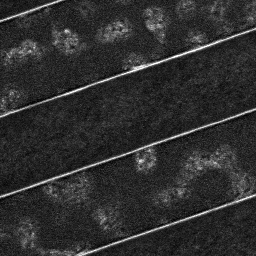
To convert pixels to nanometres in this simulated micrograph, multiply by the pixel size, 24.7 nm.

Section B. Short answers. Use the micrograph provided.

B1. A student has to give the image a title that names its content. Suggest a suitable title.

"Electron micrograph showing one or a few lines or trenches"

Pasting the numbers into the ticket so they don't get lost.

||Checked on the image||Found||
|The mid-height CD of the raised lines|1880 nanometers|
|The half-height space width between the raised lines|2010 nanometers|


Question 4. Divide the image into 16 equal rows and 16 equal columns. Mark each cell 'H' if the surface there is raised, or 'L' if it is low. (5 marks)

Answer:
HHLLLLLLLLLLLLLL
LLLLLLLLLLLLLLLL
LLLLLLLLLLLLLLHH
LLLLLLLLLLLHHHHH
LLLLLLLLHHHHHHHH
LLLLLHHHHHHHHHHH
LLHHHHHHHHHHHHHH
HHHHHHHHHHHHHHLL
HHHHHHHHHHHLLLLL
HHHHHHHHLLLLLLLL
HHHHHLLLLLLLLLLL
HHLLLLLLLLLLLLLL
LLLLLLLLLLLLLLLH
LLLLLLLLLLLLHHHH
LLLLLLLLLHHHHHHH
LLLLLLHHHHHHHHHH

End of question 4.